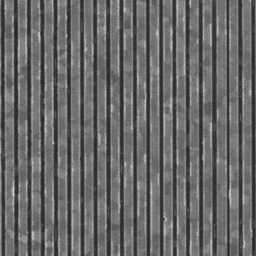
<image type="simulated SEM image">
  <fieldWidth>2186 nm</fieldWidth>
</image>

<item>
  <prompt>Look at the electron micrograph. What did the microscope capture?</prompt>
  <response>parallel lines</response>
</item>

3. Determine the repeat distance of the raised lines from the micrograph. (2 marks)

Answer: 113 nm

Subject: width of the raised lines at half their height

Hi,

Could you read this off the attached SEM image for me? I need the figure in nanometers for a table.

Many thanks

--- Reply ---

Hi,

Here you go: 74.7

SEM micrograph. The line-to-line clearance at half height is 37.4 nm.